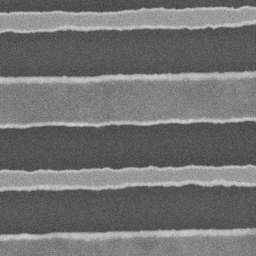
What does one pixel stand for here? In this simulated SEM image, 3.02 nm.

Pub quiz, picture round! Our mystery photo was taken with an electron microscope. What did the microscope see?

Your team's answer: lines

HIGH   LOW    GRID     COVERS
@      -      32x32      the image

--------------------------------
------@@-------@@@@@@@@@@@@@@@@@
@@@@@@@@@@@@@@@@@@@@@@@@@@@@@@@@
@@@@@@@@@@@@@@@@@@-@-@@@@-------
--------------------------------
--------------------------------
--------------------------------
--------------------------------
--------------------------------
-------------@@@@@@@@@@@@@@@@@@@
@@@@@@@@@@@@@@@@@@@@@@@@@@@@@@@@
@@@@@@@@@@@@@@@@@@@@@@@@@@@@@@@@
@@@@@@@@@@@@@@@@@@@@@@@@@@@@@@@@
@@@@@@@@@@@@@@@@@@@@@@@@@@@@@@@@
@@@@@@@@@@@@@@@@@@@@@@@@@@@@@@@@
@@@@@@@@@@@@@@@@@@@@------------
--------------------------------
--------------------------------
--------------------------------
--------------------------------
--------------------------------
@@@@@@@@@@@@@@@@@@@@@@@@@@@@@@@@
@@@@@@@@@@@@@@@@@@@@@@@@@@@@@@@@
@@@@@@@@@@@@@@@-----------------
--------------------------------
--------------------------------
--------------------------------
--------------------------------
--------------------------------
@@@@@@@@@@@@@@@@@@@@@@@@@@@@@@@@
@@@@@@@@@@@@@@@@@@@@@@@@@@@@@@@@
@@@@@@@@@@@@@@@@@@@@@@@@@@@@@@@@